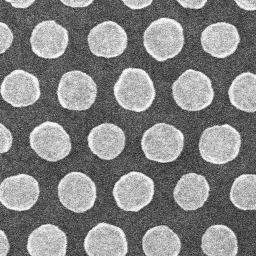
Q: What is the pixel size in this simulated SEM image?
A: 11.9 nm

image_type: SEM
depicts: a regular array of raised bodies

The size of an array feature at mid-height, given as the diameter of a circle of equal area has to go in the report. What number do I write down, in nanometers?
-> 450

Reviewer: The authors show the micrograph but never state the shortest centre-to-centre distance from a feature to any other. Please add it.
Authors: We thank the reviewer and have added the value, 671 nm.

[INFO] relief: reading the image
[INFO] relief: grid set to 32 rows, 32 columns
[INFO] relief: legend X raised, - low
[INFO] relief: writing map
-XXX----XXX-----XXX----XX-----XX
--------------------------------
--------------------X-----------
X---XXXX----XXX----XXX----XXX---
XX--XXXX---XXXXX--XXXXX--XXXXX--
X---XXXX---XXXXX--XXXXX--XXXXX--
-----XXX----XXX----XXX----XXX---
--------------------------------
--------------------------------
-XXX----XXX----XXX-----XXX----XX
-XXXX---XXXX---XXXX---XXXX---XXX
XXXXX--XXXXX---XXXX---XXXX---XXX
-XXX----XXXX---XXXX---XXXX---XXX
---------XX-----XX-----XX-----XX
--------------------------------
-------------X------X-----------
X---XXXX----XXX---XXXX---XXXXX--
X---XXXXX--XXXXX--XXXXX--XXXXX--
X---XXXXX---XXX---XXXXX--XXXXX--
-----XXX----XXX---XXXX---XXXX---
--------------------------------
--------------------------------
-XXX----XXX----XXXX---XXXX----XX
XXXXX--XXXXX--XXXXX---XXXX---XXX
XXXXX--XXXXX--XXXXX---XXXX---XXX
-XXX----XXX----XXX----XXX----XXX
--------------------------------
--------------------------------
-----XX-----XXX----XX-----XX----
X---XXXX---XXXX---XXXX---XXXX---
X---XXXX---XXXXX--XXXXX--XXXXX--
X---XXXX---XXXXX--XXXX----XXXX--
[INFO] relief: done